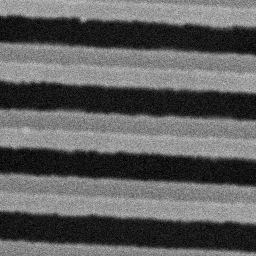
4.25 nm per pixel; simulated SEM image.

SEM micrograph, lines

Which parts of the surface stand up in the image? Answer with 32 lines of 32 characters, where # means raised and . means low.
################################
################################
..........#.....################
................................
................................
................................
######################..........
################################
################################
################################
........########################
...............................#
................................
................................
###############.................
################################
################################
################################
......##########################
........................#.######
................................
................................
###############.................
################################
################################
################################
...#############################
......................##.#######
................................
................................
######..........................
#############################...